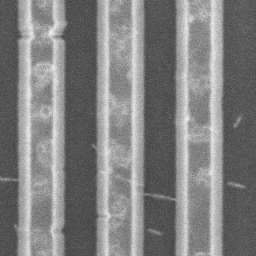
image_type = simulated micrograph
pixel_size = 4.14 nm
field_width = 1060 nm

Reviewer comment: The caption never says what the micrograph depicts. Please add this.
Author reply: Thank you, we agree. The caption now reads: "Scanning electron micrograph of one or a few lines or trenches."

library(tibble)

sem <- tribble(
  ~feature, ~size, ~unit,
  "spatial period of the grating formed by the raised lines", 326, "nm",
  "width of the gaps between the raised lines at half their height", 181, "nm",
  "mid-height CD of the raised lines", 145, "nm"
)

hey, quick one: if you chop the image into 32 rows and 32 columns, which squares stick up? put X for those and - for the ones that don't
---XXXX------XXXX------XXXX-----
---XXXX------XXXX------XXXX-----
---XXXX------XXXX------XXXX-----
---XXXX------XXXX------XXXX-----
---XXXX------XXXX------XXXX-----
---XXXX------XXXX------XXXX-----
---XXXX------XXXX------XXXX-----
---XXXX------XXXX------XXXX-----
---XXXX------XXXX------XXXX-----
---XXXX------XXXX------XXXX-----
---XXXX------XXXX------XXXX-----
---XXXX------XXXX------XXXX-----
---XXXX------XXXX------XXXX-----
---XXXX------XXXX------XXXX-----
---XXXX------XXXX------XXXX-----
---XXXX------XXXX------XXXX-----
---XXXX------XXXX------XXXX-----
---XXXX------XXXX------XXXX-----
---XXXX------XXXX------XXXX-----
---XXXX------XXXX------XXXX-----
---XXXX------XXXX------XXXX-----
---XXXX------XXXX------XXXX-----
---XXXX------XXXX------XXXX-----
---XXXX------XXXX------XXXX-----
---XXXX------XXXX------XXXX-----
---XXXX------XXXX------XXXX-----
---XXXX------XXXX------XXXX-----
---XXXX------XXXX------XXXX-----
---XXXX------XXXX------XXXX-----
---XXXX------XXXX------XXXX-----
---XXXX------XXXX------XXXX-----
---XXXX------XXXX------XXXX-----